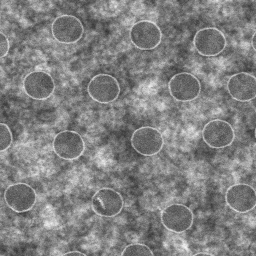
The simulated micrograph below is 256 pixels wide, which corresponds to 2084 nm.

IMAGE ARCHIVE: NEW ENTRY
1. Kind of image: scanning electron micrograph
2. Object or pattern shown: a regular array of raised bodies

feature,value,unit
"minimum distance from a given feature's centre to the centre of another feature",527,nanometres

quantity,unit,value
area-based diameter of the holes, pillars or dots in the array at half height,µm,0.243